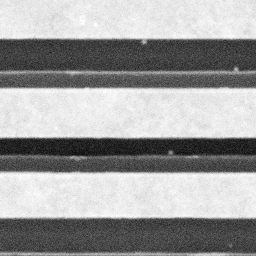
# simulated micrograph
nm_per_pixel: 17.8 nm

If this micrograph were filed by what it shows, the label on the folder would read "lines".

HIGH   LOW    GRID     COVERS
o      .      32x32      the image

oooooooooooooooooooooooooooooooo
oooooooooooooooooooooooooooooooo
oooooooooooooooooooooooooooooooo
oooooooooooooooooooooooooooooooo
oooooooooooooooooooooooooooooooo
................................
................................
................................
................................
................................
................................
oooooooooooooooooooooooooooooooo
oooooooooooooooooooooooooooooooo
oooooooooooooooooooooooooooooooo
oooooooooooooooooooooooooooooooo
oooooooooooooooooooooooooooooooo
oooooooooooooooooooooooooooooooo
................................
................................
................................
................................
................................
oooooooooooooooooooooooooooooooo
oooooooooooooooooooooooooooooooo
oooooooooooooooooooooooooooooooo
oooooooooooooooooooooooooooooooo
oooooooooooooooooooooooooooooooo
................................
................................
................................
................................
................................